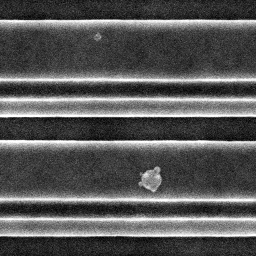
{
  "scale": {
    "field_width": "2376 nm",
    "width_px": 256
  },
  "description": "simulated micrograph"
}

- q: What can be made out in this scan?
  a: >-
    lines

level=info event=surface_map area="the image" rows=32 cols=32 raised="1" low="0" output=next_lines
00000000000000000000000000000000
00000000000000000000000000000000
00000000000000000000000000000000
11111111111111111111111111111111
11111111111111111111111111111111
11111111111111111111111111111111
11111111111111111111111111111111
11111111111111111111111111111111
11111111111111111111111111111111
11111111111111111111111111111111
00000000000000000000000000000000
00000000000000000000000000000000
11111111111111111111111111111111
11111111111111111111111111111111
11111000000000000000000000000000
00000000000000000000000000000000
00000000000000000000000000000000
00000000000000000000000000000000
11111111111111111111111111111111
11111111111111111111111111111111
11111111111111111111111111111111
11111111111111111111111111111111
11111111111111111111111111111111
11111111111111111111111111111111
11111111111111111111111111111111
00000000000000000000000000000000
00000000000000000000000000000000
11111111111111111111111111111111
11111111111111111111111111111111
00000000000000000000000000000000
00000000000000000000000000000000
00000000000000000000000000000000